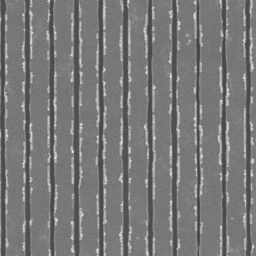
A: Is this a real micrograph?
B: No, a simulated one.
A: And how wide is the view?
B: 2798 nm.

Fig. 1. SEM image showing parallel lines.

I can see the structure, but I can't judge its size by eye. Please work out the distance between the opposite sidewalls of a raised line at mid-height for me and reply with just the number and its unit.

210 nanometers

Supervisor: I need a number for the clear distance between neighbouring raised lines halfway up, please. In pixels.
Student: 4.75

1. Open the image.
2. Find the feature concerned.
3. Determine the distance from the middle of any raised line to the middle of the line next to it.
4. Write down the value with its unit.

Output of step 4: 0.269 um